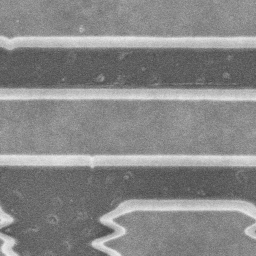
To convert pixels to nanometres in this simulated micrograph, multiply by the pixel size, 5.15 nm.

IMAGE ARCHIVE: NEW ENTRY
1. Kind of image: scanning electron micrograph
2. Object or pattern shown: one or a few lines or trenches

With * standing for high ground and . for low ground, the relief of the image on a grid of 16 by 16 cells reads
****************
****************
****************
................
................
................
****************
****************
****************
****************
................
................
................
.......*********
.......*********
*.....**********